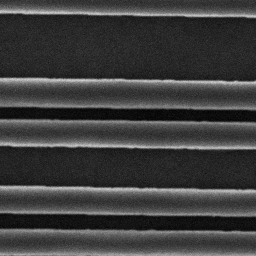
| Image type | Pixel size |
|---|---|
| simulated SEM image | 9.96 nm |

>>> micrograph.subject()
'lines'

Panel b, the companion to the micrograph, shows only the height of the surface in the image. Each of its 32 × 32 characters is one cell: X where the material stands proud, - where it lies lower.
XXXXXXXXXXXXXXXXXXXXXXXXXXXXXXXX
-XXXXXXXXXXXXXXXXXXXXXXXXXXXXXXX
--------------------------------
--------------------------------
--------------------------------
--------------------------------
--------------------------------
--------------------------------
--------------------------------
--------------------------------
XXXXXXXXXXXXXXXXXXXXXXXXXXXXXXXX
XXXXXXXXXXXXXXXXXXXXXXXXXXXXXXXX
XXXXXXXXXXXXXXXXXXXXXXXXXXXXXXXX
-------------------XXXXXXXXXXXXX
--------------------------------
XXXXXXXXXXXXXXXXXXXXXXXXXXXXXXXX
XXXXXXXXXXXXXXXXXXXXXXXXXXXXXXXX
XXXXXXXXXXXXXXXXXXXXXXXXXXXXXXXX
-------------------------XXXXXXX
--------------------------------
--------------------------------
--------------------------------
--------------------------------
XXXXXXXXXX----------------------
XXXXXXXXXXXXXXXXXXXXXXXXXXXXXXXX
XXXXXXXXXXXXXXXXXXXXXXXXXXXXXXXX
XXXXXXXXXXXXXXXXXXXXXXXXXXXXXXXX
--------------------------------
--------------------------------
XXXXXXXXXXXXXXXXXXXXXXXXXXXXXXXX
XXXXXXXXXXXXXXXXXXXXXXXXXXXXXXXX
XXXXXXXXXXXXXXXXXXXXXXXXXXXXXXXX